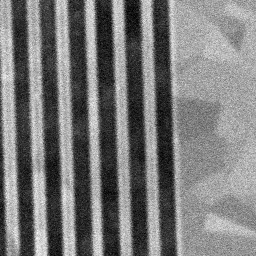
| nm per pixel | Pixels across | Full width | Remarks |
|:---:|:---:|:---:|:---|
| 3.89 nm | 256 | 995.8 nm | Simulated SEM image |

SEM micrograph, parallel lines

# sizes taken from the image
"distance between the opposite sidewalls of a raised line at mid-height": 0.0358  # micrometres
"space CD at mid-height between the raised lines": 75.4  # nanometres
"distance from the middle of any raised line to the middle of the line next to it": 110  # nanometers